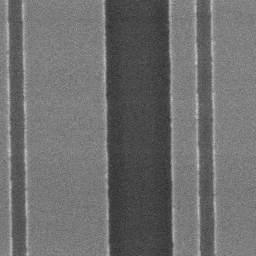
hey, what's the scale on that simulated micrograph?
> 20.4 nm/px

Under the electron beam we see lines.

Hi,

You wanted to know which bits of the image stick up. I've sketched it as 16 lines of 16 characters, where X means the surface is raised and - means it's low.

XXXXXX-----XXXXX
XXXXXXX----XXXXX
XXXXXXX----XXXXX
XXXXXXX----XXXXX
XXXXXXX----XXXXX
XXXXXXX----XXXXX
XXXXXXX----XXXXX
XXXXXXX----XXXXX
XXXXXXX----XXXXX
XXXXXXX----XXXXX
XXXXXXX----XXXXX
XXXXXXX----XXXXX
XXXXXXX----XXXXX
XXXXXXX----XXXXX
XXXXXXX----XXXXX
XXXXXXX----XXXXX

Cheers